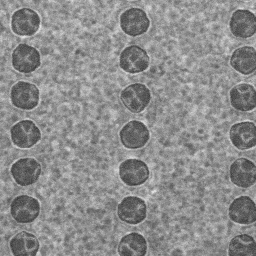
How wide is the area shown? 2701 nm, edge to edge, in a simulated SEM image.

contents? a regular array of holes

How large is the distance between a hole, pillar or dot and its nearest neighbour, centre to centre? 395 nm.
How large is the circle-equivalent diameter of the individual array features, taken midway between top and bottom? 0.316 um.